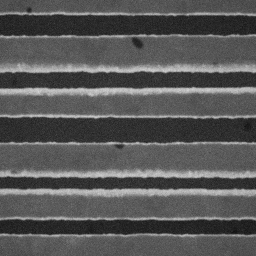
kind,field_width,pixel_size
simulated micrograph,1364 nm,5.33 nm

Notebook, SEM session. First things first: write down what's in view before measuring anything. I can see lines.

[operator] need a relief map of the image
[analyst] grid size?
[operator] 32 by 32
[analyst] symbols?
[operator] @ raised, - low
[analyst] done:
@@@@@@@@@@@@@@@@@@@@@@@@@@@@@@@@
@@@@@@@@@@@@@@@@@@@@@@@@@@@@@@@@
--------------------------------
--------------------------------
@--@@@-@@@--@@@@@@@@@@@@@@@@@@@@
@@@@@@@@@@@@@@@@@@@@@@@@@@@@@@@@
@@@@@@@@@@@@@@@@@@@@@@@@@@@@@@@@
@@@@@@@@@@@@@@@@@@@@@@@@@@@@@@@@
@@@@@@@@@@@@@@@@@@@@@@@@@@@@@@@@
--------------------------------
--------------------------------
@@@@@@@@@@@@@@@@@@@@@@@@@@@@@@@@
@@@@@@@@@@@@@@@@@@@@@@@@@@@@@@@@
@@@@@@@@@@@@@@@@@@@@@@@@@@@@@@@@
@@@@@@@@@@@@@@@@@@@@@@@@@@@@@@@@
--------------------------------
--------------------------------
--------------------------------
@@@@@@@@@@@@@@@@@@@@@@@@@@@@@@@@
@@@@@@@@@@@@@@@@@@@@@@@@@@@@@@@@
@@@@@@@@@@@@@@@@@@@@@@@@@@@@@@@@
@@@@@@@@@@@@@@@@@@@@@@@@@@@@@@@@
--------------------------------
--------------------------------
@@@@@@@@@@@@@@@@@@@@@@@@@@@@@@@@
@@@@@@@@@@@@@@@@@@@@@@@@@@@@@@@@
@@@@@@@@@@@@@@@@@@@@@@@@@@@@@@@@
--------------------------------
--------------------------------
@@@@@@@@@@@@@@@@@@@@@@@@@@@@@@@@
@@@@@@@@@@@@@@@@@@@@@@@@@@@@@@@@
@@@@@@@@@@@@@@@@@@@@@@@@@@@@@@@@